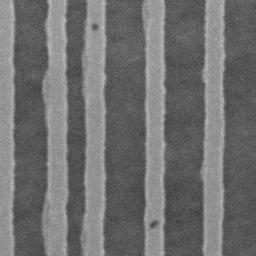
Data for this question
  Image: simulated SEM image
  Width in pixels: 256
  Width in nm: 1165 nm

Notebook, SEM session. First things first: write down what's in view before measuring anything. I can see lines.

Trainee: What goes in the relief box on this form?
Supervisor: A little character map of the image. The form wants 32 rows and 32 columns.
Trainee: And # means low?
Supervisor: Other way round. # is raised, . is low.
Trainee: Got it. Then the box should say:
##....##...##.....###.....##....
##....##...##.....###.....##....
##....##...##.....###.....##....
##....##...##.....##......##....
##....##...##.....##......##....
##....##...##.....##......##....
##....##...##.....##......##....
##....##..###.....###.....##....
##....##..###.....###.....##....
##....##...##.....###.....##....
##...###...##.....##......##....
##...###...##.....###.....##....
##...###...##.....###.....##....
##....##...##.....###.....##....
##....##...##.....###.....##....
##....##...##.....##......##....
##....##...##.....##......##....
##....##...##.....###.....##....
##....##...##.....###.....##....
##....##...##.....###.....##....
##....##...##.....###.....##....
##....##...##.....##.....###....
##....##...##.....##.....###....
##....##...##.....###.....##....
##....##...##.....###.....##....
##....##...##.....###.....##....
##...###...##.....##......##....
##...###...##.....###.....##....
##...###..###.....##......##....
##...###..###.....##......##....
##....##..###.....##.....###....
##....##..###.....###....###....